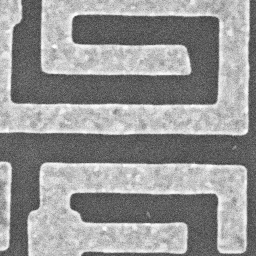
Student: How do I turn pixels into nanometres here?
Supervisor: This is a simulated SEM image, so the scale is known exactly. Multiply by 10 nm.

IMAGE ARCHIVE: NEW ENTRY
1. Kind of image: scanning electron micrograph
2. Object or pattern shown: wiring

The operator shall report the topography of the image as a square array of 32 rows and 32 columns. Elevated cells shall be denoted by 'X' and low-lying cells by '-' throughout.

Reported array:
XXX--XXXXXXXXXXXXXXXXXXXXXXXXXX-
XXX--XXXXXXXXXXXXXXXXXXXXXXXXXX-
XXX--XXXX------------------XXXX-
XX---XXXX------------------XXXX-
X----XXXX------------------XXXX-
X----XXXXX-----------------XXXX-
X----XXXXXXXXXXXXXXXXXX----XXXX-
X----XXXXXXXXXXXXXXXXXXX---XXXX-
X----XXXXXXXXXXXXXXXXXXX---XXXX-
X--------------------------XXXX-
X--------------------------XXXX-
X--------------------------XXXX-
X--------------------------XXXX-
XXXXXXXXXXXXXXXXXXXXXXXXXXXXXXX-
XXXXXXXXXXXXXXXXXXXXXXXXXXXXXXX-
XXXXXXXXXXXXXXXXXXXXXXXXXXXXXXX-
XX-XXXXXXXXXXXXXXXXXXXXXXXXXXXX-
--------------------------------
--------------------------------
--------------------------------
X-----XX------------------------
X----XXXXXXXXXXXXXXXXXXXXXXXXXX-
X----XXXXXXXXXXXXXXXXXXXXXXXXXX-
X----XXXXXXXXXXXXXXXXXXXXXXXXXX-
X----XXXX------------------XXXX-
X----XXXX------------------XXXX-
X---XXXXX------------------XXXX-
X---XXXXXX-----------------XXXX-
X---XXXXXXXXXXXXXXXXXXX----XXXX-
X---XXXXXXXXXXXXXXXXXXX----XXXX-
X---XXXXXXXXXXXXXXXXXXX----XXXX-
----XXXXXXX----------XX-----XX--